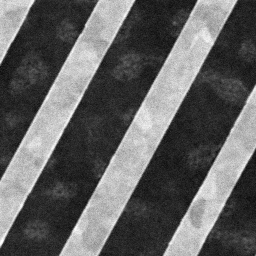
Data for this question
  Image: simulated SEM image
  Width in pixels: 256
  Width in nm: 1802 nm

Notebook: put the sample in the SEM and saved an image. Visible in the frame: one or a few lines or trenches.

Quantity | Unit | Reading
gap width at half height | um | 0.404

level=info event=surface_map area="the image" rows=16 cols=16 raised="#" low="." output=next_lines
##....##....###.
#....###....##..
#....##....##...
....##.....##...
....##....##....
...##....###....
...##....##....#
..##....###....#
..##....##....##
.##....###....##
###....##....##.
##....###....##.
##....##....##..
#....##.....##..
.....##....##...
....##....###...